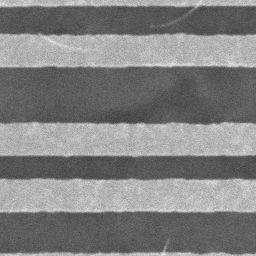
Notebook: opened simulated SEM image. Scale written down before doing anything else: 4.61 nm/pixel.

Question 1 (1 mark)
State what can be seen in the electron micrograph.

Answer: lines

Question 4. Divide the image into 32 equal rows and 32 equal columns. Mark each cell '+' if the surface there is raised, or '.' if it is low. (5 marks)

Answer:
++++++++++++++++++++++++++++++++
................................
................................
................................
+++++++++.+++++++.+++++++.+++.++
++++++++++++++++++++++++++++++++
++++++++++++++++++++++++++++++++
++++++++++++++++++++++++++++++++
................................
................................
................................
................................
................................
................................
................................
++++++++++++++++.+..++++..++++++
++++++++++++++++++++++++++++++++
++++++++++++++++++++++++++++++++
++++++++++++++++++++++++++++++++
........+.......+...............
................................
................................
+...+++..++.....+...+++.....++..
++++++++++++++++++++++++++++++++
++++++++++++++++++++++++++++++++
++++++++++++++++++++++++++++++++
................................
................................
................................
................................
................................
................................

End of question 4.